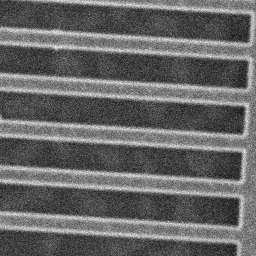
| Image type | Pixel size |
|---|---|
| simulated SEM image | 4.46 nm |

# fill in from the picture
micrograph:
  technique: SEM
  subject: parallel lines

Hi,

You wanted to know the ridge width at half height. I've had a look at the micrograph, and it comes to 14.7 pixels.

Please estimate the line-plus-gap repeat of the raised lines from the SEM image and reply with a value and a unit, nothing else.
205 nanometers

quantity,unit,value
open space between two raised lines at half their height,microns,0.14